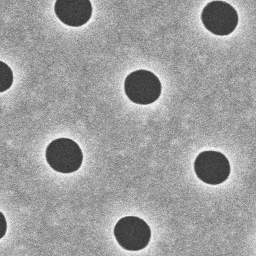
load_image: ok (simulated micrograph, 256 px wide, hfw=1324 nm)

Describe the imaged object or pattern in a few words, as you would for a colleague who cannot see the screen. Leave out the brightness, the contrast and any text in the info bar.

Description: holes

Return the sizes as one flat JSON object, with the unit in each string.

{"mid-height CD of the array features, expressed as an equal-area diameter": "36 px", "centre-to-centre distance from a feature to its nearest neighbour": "535 nm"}